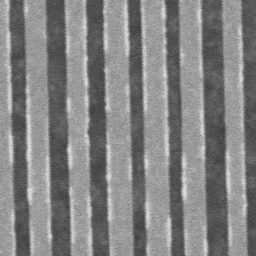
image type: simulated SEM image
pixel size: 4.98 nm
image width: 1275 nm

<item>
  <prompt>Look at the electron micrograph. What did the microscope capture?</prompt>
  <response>parallel lines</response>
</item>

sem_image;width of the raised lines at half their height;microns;0.108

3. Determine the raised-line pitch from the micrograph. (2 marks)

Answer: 39.5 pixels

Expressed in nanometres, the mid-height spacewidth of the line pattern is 79.7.